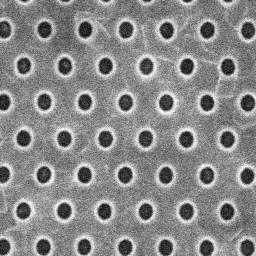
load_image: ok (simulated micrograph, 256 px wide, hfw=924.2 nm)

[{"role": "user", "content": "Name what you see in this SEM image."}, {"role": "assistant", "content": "a regular array of holes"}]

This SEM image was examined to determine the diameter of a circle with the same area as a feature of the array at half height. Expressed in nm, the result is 59.2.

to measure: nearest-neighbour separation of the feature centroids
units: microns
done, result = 0.147